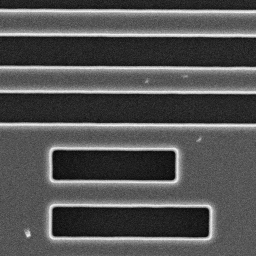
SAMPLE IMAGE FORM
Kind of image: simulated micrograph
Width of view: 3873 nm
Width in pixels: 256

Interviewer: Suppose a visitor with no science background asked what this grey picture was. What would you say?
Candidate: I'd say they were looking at groups of lines, slits or small figures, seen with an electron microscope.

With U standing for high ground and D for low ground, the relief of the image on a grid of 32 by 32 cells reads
DDDDDDDDDDDDDDDDDDDDDDDDDDDDDDDD
UUUUUUUUUUUUUUUUUUUUUUUUUUUUUUUU
UUUUUUUUUUUUUUUUUUUUUUUUUUUUUUUU
UUUUUUUUUUUUUUUUUUUUUUUUUUUUUUUU
DDDDDDDDDDDDDDDDDDDDDDDDDDDDDDDD
DDDDDDDDDDDDDDDDDDDDDDDDDDDDDDDD
DDDDDDDDDDDDDDDDDDDDDDDDDDDDDDDD
DDDDDDDDDDDDDDDDDDDDDDDDDDDDDDDD
UUUUUUDDDDDDDDDDDDDDDDDDDDDDDDDD
UUUUUUUUUUUUUUUUUUUUUUUUUUUUUUUU
UUUUUUUUUUUUUUUUUUUUUUUUUUUUUUUU
DDDDDDDDDDDDDDDDDUUUUUUUUUUUUUUU
DDDDDDDDDDDDDDDDDDDDDDDDDDDDDDDD
DDDDDDDDDDDDDDDDDDDDDDDDDDDDDDDD
DDDDDDDDDDDDDDDDDDDDDDDDDDDDDDDD
DDDDDDDDDDDDDDDDDDDDDDDDDDDDDDDD
UUUUUUUUUUUUUUUUUUUUUUUUUUUUUUUU
UUUUUUUUUUUUUUUUUUUUUUUUUUUUUUUU
UUUUUUUUUUUUUUUUUUUUUUUUUUUUUUUU
UUUUUUDDDDDDDDDDDDDDDDUUUUUUUUUU
UUUUUUDDDDDDDDDDDDDDDDUUUUUUUUUU
UUUUUUDDDDDDDDDDDDDDDDUUUUUUUUUU
UUUUUUUDDDDDDDDDDDDDDDUUUUUUUUUU
UUUUUUUUUUUUUUUUUUUUUUUUUUUUUUUU
UUUUUUUUUUUUUUUUUUUUUUUUUUUUUUUU
UUUUUUUUUUUUUUUUUUUUUUUUUUUUUUUU
UUUUUUDDDDDDDDDDDDDDDDDDDDUUUUUU
UUUUUUDDDDDDDDDDDDDDDDDDDDUUUUUU
UUUUUUDDDDDDDDDDDDDDDDDDDDUUUUUU
UUUUUUUDDDDDDDDDDDDDDDDDDDUUUUUU
UUUUUUUUUUUUUUUUUUUUUUUUUUUUUUUU
UUUUUUUUUUUUUUUUUUUUUUUUUUUUUUUU